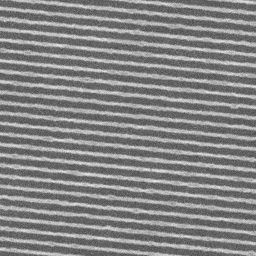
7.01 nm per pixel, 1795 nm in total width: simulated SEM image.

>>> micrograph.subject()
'parallel lines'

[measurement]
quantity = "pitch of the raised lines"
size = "73 nm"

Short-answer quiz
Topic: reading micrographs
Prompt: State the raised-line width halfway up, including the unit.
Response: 20 nm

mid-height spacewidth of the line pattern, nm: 53.1